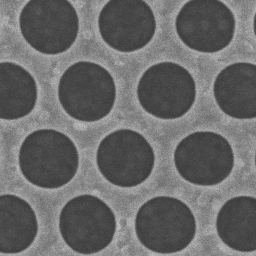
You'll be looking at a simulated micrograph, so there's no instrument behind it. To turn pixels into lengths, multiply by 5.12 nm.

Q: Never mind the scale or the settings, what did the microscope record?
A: holes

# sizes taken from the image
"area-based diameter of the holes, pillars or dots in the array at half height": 300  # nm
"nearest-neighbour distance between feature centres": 394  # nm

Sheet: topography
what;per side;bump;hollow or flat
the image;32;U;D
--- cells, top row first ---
UUUDDDDDDUUUUDDDDDUUUUUDDDDDUUUU
UUUDDDDDDDUUUDDDDDDUUUDDDDDDDUUU
UUDDDDDDDDUUDDDDDDDUUUDDDDDDDUUU
UUDDDDDDDDUUDDDDDDDUUUDDDDDDDUUU
UUUDDDDDDDUUUDDDDDDUUUDDDDDDDUUU
UUUUDDDDDUUUUDDDDDUUUUUDDDDDDUUU
UUUUUDDDUUUUUUUDDUUUUUUUUDDUUUUU
UUUUUUUUUUUUUUUUUUUUUUUUUUUUUUUU
DDDUUUUUUDDDDUUUUUUDDDDUUUUUDDDD
DDDDUUUUDDDDDDUUUUDDDDDDUUUDDDDD
DDDDUUUDDDDDDDUUUDDDDDDDUUUDDDDD
DDDDDUUDDDDDDDDUUDDDDDDDDUUDDDDD
DDDDDUUDDDDDDDUUUDDDDDDDUUUDDDDD
DDDDUUUUDDDDDDUUUUDDDDDDUUUDDDDD
DDDUUUUUUDDDDUUUUUUDDDDUUUUUUDDD
UUUUUUUUUUUUUUUUUUUUUUUUUUUUUUUU
UUUUDDDUUUUUUUDDDUUUUUUUDDDUUUUU
UUUDDDDDDUUUUDDDDDUUUUUDDDDDUUUU
UUUDDDDDDDUUDDDDDDDUUUDDDDDDDUUU
UUDDDDDDDDUUDDDDDDDUUUDDDDDDDUUU
UUDDDDDDDDUUDDDDDDDUUUDDDDDDDUUU
UUUDDDDDDUUUDDDDDDDUUUDDDDDDDUUU
UUUDDDDDDUUUUDDDDDUUUUUDDDDDUUUU
UUUUUUDUUUUUUUUUUUUUUUUUUUUUUUUU
DDUUUUUUUUDDUUUUUUUUDUUUUUUUUUDU
DDDDUUUUDDDDDUUUUUDDDDDUUUUUDDDD
DDDDUUUUDDDDDDUUUDDDDDDDUUUDDDDD
DDDDDUUDDDDDDDDUUDDDDDDDUUUDDDDD
DDDDDUUDDDDDDDDUUDDDDDDDDUUDDDDD
DDDDUUUUDDDDDDUUUDDDDDDDUUUDDDDD
DDDDUUUUDDDDDDUUUUDDDDDDUUUUDDDD
DDDUUUUUUDDDUUUUUUUDDDUUUUUUUUUU